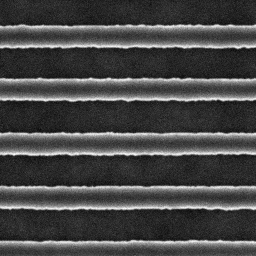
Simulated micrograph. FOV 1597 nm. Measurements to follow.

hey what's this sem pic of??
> lines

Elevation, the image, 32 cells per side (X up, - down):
--------------------------------
--------------------------------
--------------------------------
XXXXXXXXXXXXXXXXXXXXXXXXXXXXXXXX
XXXXXXXXXXXXXXXXXXXXXXXXXXXXXXXX
XXXXXXXXXXXXXXXXXXXXXXXXXXXXXXXX
--------------------------------
--------------------------------
--------------------------------
--------------------------------
XXXXXXXXXXXXXXXXXXXXXXXXXXXXXXXX
XXXXXXXXXXXXXXXXXXXXXXXXXXXXXXXX
XXXXXXXXXXXXXXXXXXXXXXXXXXXXXXXX
--------------------------------
--------------------------------
--------------------------------
--------------------------------
XXXXXXXXXXXXXXXXXXXXXXXXXXXXXXXX
XXXXXXXXXXXXXXXXXXXXXXXXXXXXXXXX
--------------------------------
--------------------------------
--------------------------------
--------------------------------
XXXXXXXXXXXXXXXXXXXXXXXXXXXXXXXX
XXXXXXXXXXXXXXXXXXXXXXXXXXXXXXXX
XXXXXXXXXXXXXXXXXXXXXXXXXXXXXXXX
--------------------------------
--------------------------------
--------------------------------
--------------------------------
XXXXXXXXXXXXXXXXXXXXXXXXXXXXXXXX
XXXXXXXXXXXXXXXXXXXXXXXXXXXXXXXX